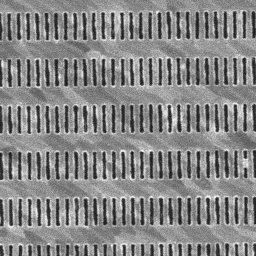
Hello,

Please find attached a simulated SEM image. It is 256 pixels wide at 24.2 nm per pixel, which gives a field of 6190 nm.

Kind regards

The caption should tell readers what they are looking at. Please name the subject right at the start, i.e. a regular array of holes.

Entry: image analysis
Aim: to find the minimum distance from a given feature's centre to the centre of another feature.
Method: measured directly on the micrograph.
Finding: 9.02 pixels